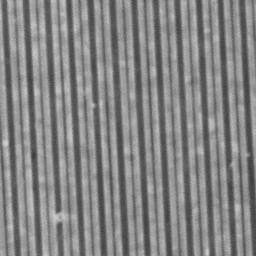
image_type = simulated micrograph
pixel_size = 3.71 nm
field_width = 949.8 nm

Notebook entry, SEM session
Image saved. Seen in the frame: parallel lines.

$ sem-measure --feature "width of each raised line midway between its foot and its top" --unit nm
21.8